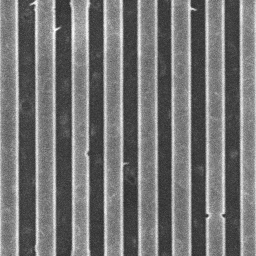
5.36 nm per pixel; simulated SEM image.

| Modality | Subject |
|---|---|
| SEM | parallel lines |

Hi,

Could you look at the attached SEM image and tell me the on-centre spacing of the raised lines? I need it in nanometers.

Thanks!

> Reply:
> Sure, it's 182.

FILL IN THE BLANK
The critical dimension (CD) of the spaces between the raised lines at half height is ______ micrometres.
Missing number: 0.0877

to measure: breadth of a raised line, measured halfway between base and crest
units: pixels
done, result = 18.1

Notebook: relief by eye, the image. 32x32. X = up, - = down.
XX--XXX--XX--XX--XXX--XX--XX--XX
XX--XXX--XX--XX--XXX--XX--XX--XX
XX---XX--XX--XX--XXX--XX--XX--XX
XX---XX--XX--XX--XXX--XX--XX--XX
XX---XX--XX--XX--XXX--XX--XX--XX
XX---XX--XX--XX--XXX--XX--XX--XX
XX---XX--XX--XX--XXX--XX--XX--XX
XX---XX--XX--XX--XXX--XX--XX--XX
XX---XX--XX--XX--XXX--XX--XX--XX
XX---XX--XX--XX--XXX--XX--XX--XX
XX---XX--XX--XX--XXX--XX--XX--XX
XX---XX--XX--XX--XXX--XX--XX--XX
XX---XX--XX--XX--XXX--XX--XX--XX
XX---XX--XX--XX--XXX--XX--XX--XX
XX---XX--XX--XX--XXX--XX--XX--XX
XX---XX--XX--XX--XXX--XX--XX--XX
XX---XX--XX--XX--XXX--XX--XX--XX
XX---XX--XX--XX--XXX--XX--XX--XX
XX---XX--XX--XX--XXX--XX--XX--XX
XX---XX--XX--XX--XXX--XX--XX--XX
XX---XX--XX--XX--XXX--XX--XX--XX
XX---XX--XX--XX--XXX--XX--XX--XX
XX---XX--XX--XX--XXX--XX--XX--XX
XX---XX--XX--XX--XXX--XX--XX--XX
XX---XX--XX--XX--XXX--XX--XX--XX
XX---XX--XX--XX--XXX--XX--XX--XX
XX---XX--XX--XX--XXX--XX--XX--XX
XX---XX--XX--XX--XXX--XX--XX--XX
XX---XX--XX--XX--XXX--XX--XX--XX
XX---XX--XX--XX--XXX--XX--XX--XX
XX---XX--XX--XX--XXX--XX--XX--XX
XX---XX--XX--XX--XXX--XX--XX--XX